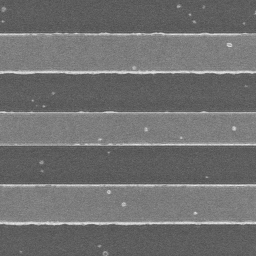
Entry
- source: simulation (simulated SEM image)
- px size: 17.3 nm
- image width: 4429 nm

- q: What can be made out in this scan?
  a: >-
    lines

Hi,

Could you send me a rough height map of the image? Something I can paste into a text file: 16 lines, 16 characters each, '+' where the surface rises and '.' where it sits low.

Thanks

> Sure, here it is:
................
................
++++++++++++++++
++++++++++++++++
++++++++++++++++
................
................
++++++++++++++++
++++++++++++++++
................
................
................
++++++++++++++++
++++++++++++++++
................
................